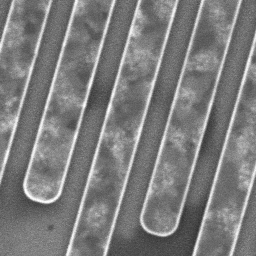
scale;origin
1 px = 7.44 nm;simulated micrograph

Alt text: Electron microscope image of parallel lines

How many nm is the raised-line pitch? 451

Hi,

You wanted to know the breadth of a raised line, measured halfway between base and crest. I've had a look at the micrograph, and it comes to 0.268 micrometres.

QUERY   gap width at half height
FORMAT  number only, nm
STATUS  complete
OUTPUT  181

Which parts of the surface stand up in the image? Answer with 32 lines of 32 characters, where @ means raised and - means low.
--@@@@---@@@@@---@@@@@---@@@@@--
-@@@@@---@@@@@---@@@@@---@@@@@--
-@@@@@---@@@@@---@@@@----@@@@---
-@@@@----@@@@----@@@@---@@@@@---
@@@@@---@@@@@---@@@@@---@@@@@---
@@@@@---@@@@@---@@@@@---@@@@----
@@@@@---@@@@----@@@@----@@@@---@
@@@@---@@@@@---@@@@@---@@@@@---@
@@@@---@@@@@---@@@@@---@@@@@---@
@@@@---@@@@@---@@@@----@@@@----@
@@@----@@@@----@@@@---@@@@@---@@
@@@---@@@@@---@@@@@---@@@@@---@@
@@@---@@@@@---@@@@@---@@@@----@@
@@@---@@@@@---@@@@----@@@@---@@@
@@---@@@@@---@@@@@---@@@@@---@@@
@@---@@@@@---@@@@@---@@@@@---@@@
@@---@@@@@---@@@@----@@@@----@@@
@----@@@@----@@@@---@@@@@---@@@@
@---@@@@@---@@@@@---@@@@@---@@@@
@---@@@@@---@@@@@---@@@@----@@@@
@---@@@@@---@@@@----@@@@---@@@@@
---@@@@@---@@@@@---@@@@@---@@@@@
---@@@@@---@@@@@---@@@@@---@@@@@
---@@@@@---@@@@@---@@@@----@@@@-
----@@@---@@@@@---@@@@@---@@@@@-
----------@@@@@---@@@@@---@@@@@-
----------@@@@@---@@@@@---@@@@--
----------@@@@----@@@@----@@@@--
---------@@@@@----@@@@---@@@@@--
---------@@@@@-----------@@@@@--
---------@@@@@-----------@@@@---
--------@@@@@-----------@@@@@---